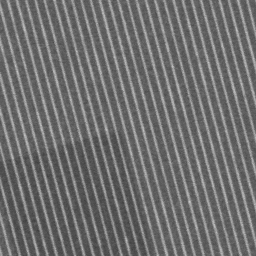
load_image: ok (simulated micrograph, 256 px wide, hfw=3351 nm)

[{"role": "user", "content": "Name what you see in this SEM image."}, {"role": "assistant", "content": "parallel lines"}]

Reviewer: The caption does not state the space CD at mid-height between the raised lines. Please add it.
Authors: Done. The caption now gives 96.5 nanometres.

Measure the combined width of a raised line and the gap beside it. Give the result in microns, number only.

0.117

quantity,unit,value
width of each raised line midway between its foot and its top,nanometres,19